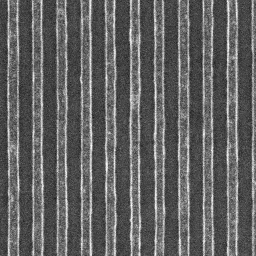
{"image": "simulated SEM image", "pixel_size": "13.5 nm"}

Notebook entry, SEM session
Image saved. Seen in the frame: parallel lines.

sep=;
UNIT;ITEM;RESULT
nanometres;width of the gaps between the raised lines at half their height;210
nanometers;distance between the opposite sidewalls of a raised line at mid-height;118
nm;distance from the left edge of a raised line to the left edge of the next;330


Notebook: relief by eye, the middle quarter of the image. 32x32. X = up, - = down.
X---XXX----XX----XX----XX----XX-
X----XX----XX----XX----XX----XX-
----XXX----XX----XX----XX----XX-
----XXX----XX----XX----XX----XX-
----XXX----XX----XX----XX----XX-
----XXX----XX----XX----XX----XX-
-----XX----XX----XX----XX----XX-
-----XX----XX----XX----XX----XX-
-----XX----XX----XX----XX----XX-
-----XX----XX----XX----XX----XX-
-----XX---XXX----XX----XX----XX-
-----XX---XXX----XX----XX----XX-
-----XX----XX----XX----XX----XX-
-----XX----XX----XX----XX----XX-
-----XX----XX----XX----XX----XX-
X----XX----XX----XX----XX----XX-
X----XX----XX----XX----XX----XX-
X---XXX----XX----XX----XX----XX-
X---XXX----XX----XX----XX----XX-
X---XXX---XXX----XX----XX----XX-
X---XXX---XXX----XX----XX----XX-
----XXX---XXX----XX----XX----XX-
----XXX---XXX----XX----XX----XX-
----XXX----X-----XX----XX----XX-
----XXX----X-----XX----XX----XX-
----XXX----X-----XX----XX----XX-
X---XXX----X-----XX----XX----XX-
X----XX----XX----XX----XX----XX-
X----XX----XX----XX----XX----XX-
X---XXX----XX----XX----XX----XX-
X---XXX----XX----XX----XX----XX-
X---XXX----XX----XX----XX----XX-